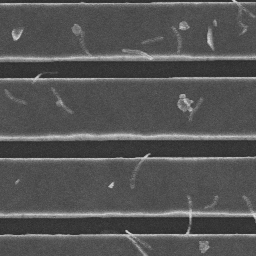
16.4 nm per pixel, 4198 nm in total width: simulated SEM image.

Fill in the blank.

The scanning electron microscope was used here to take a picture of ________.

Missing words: lines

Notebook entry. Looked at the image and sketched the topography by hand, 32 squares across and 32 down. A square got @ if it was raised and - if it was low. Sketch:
@@@@@@@@@@@@@@@@@@@@@@@@@@@@@@@@
@@@@@@@@@@@@@@@@@@@@@@@@@@@@@@@@
@@@@@@@@@@@@@@@@@@@@@@@@@@@@@@@@
@@@@@@@@@@@@@@@@@@@@@@@@@@@@@@@@
@@@@@@@@@@@@@@@@@@@@@@@@@@@@@@@@
@@@@@@@@@@@@@@@@@@@@@@@@@@@@@@@@
@@@@@@@@@@@@@@@@@@@@@@@@@@@@@@@@
--------------------------------
--------------------------------
--------------------------------
@@@@@@@@@@@@@@@@@@@@@@@@@@@@@@@@
@@@@@@@@@@@@@@@@@@@@@@@@@@@@@@@@
@@@@@@@@@@@@@@@@@@@@@@@@@@@@@@@@
@@@@@@@@@@@@@@@@@@@@@@@@@@@@@@@@
@@@@@@@@@@@@@@@@@@@@@@@@@@@@@@@@
@@@@@@@@@@@@@@@@@@@@@@@@@@@@@@@@
@@@@@@@@@@@@@@@@@@@@@@@@@@@@@@@@
--------------------------------
--------------------------------
--------------------------------
@@@@@@@@@@@@@@@@@@@@@@@@@@@@@@@@
@@@@@@@@@@@@@@@@@@@@@@@@@@@@@@@@
@@@@@@@@@@@@@@@@@@@@@@@@@@@@@@@@
@@@@@@@@@@@@@@@@@@@@@@@@@@@@@@@@
@@@@@@@@@@@@@@@@@@@@@@@@@@@@@@@@
@@@@@@@@@@@@@@@@@@@@@@@@@@@@@@@@
@@@@@@@@@@@@@@@@@@@@@@@@@@@@@@@@
--------------------------------
--------------------------------
@@@@@@@@@@@@@@@@@@@@@@@@@@@@@@@@
@@@@@@@@@@@@@@@@@@@@@@@@@@@@@@@@
@@@@@@@@@@@@@@@@@@@@@@@@@@@@@@@@